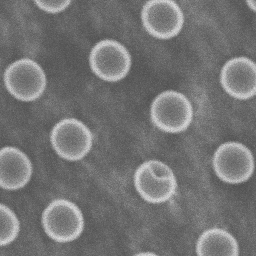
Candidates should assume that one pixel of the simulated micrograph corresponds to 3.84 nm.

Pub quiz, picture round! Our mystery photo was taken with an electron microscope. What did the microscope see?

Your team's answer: raised bodies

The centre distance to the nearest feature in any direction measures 0.289 um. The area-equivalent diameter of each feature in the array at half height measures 147 nanometers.